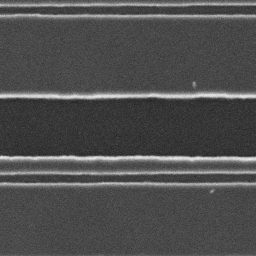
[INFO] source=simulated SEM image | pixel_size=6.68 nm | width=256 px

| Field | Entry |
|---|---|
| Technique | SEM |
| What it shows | lines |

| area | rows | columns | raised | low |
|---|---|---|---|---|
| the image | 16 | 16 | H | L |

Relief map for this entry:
HHHHHHHHHHHHHHHH
HHHHHHHHHHHHHHHH
HHHHHHHHHHHHHHHH
HHHHHHHHHHHHHHHH
HHHHHHHHHHHHHHHH
HHHHHHHHHHHHHHHH
LLLLLLLLLLLLLLLL
LLLLLLLLLLLLLLLL
LLLLLLLLLLLLLLLL
LLLLLLLLLLLLLLLL
HHHHHHHHHHHHHHHH
HHHHHHHHHHHHHHHH
HHHHHHHHHHHHHHHH
HHHHHHHHHHHHHHHH
HHHHHHHHHHHHHHHH
HHHHHHHHHHHHHHHH